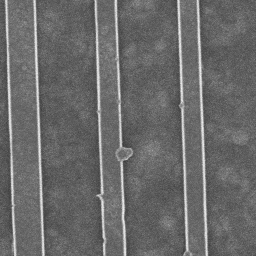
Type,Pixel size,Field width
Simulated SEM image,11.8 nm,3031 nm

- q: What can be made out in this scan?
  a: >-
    one or a few lines or trenches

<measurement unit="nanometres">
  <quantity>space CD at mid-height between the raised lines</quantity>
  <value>726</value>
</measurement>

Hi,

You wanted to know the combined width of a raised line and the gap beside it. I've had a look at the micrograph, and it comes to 0.994 µm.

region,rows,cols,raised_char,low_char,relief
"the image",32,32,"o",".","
.ooo........oo........ooo.......
.ooo........oo........ooo.......
.ooo........oo........ooo.......
.ooo........ooo.......ooo.......
.ooo........ooo........oo.......
.ooo........ooo........oo.......
.ooo........ooo........oo.......
.ooo........ooo........oo.......
.oooo.......ooo........oo.......
.oooo.......ooo........oo.......
.oooo.......ooo........oo.......
.oooo.......ooo........oo.......
.oooo.......ooo........oo.......
.oooo.......ooo........oo.......
.oooo.......ooo........oo.......
.oooo.......ooo........oo.......
.oooo.......ooo........oo.......
.oooo.......ooo........oo.......
.oooo........ooo.......oo.......
.oooo........ooo.......oo.......
.oooo........oo........oo.......
.oooo........oo........oo.......
..ooo........oo........oo.......
..ooo........oo........ooo......
..ooo........oo........ooo......
..ooo........oo........ooo......
..ooo........oo........ooo......
..ooo........oo........ooo......
..ooo........ooo.......ooo......
..ooo........ooo.......ooo......
..ooo........ooo.......ooo......
..ooo........ooo.......ooo......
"